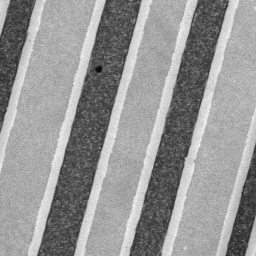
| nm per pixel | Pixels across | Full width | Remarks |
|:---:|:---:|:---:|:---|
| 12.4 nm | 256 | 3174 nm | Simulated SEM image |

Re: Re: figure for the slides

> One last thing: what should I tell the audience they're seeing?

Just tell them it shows one or a few lines or trenches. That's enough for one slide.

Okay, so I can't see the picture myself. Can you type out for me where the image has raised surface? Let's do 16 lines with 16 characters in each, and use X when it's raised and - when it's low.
--XXXX---XXX---X
--XXXX---XXX--XX
--XXXX---XX---XX
--XXX---XXX---XX
-XXXX---XXX--XXX
-XXXX---XXX--XXX
-XXXX--XXX---XXX
-XXX---XXX---XXX
XXXX---XXX--XXXX
XXXX---XX---XXX-
XXX---XXX---XXX-
XXX---XXX---XXX-
XXX---XXX--XXXX-
XXX---XX---XXX--
XX---XXX---XXX--
XX---XXX---XXX--